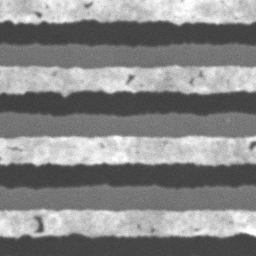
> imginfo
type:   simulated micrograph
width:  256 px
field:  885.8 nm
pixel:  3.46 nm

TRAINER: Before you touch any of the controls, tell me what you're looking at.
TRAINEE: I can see lines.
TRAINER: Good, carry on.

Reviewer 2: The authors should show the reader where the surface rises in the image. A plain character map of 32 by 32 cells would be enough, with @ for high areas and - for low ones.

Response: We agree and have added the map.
@@@@@@@@@@@@@@@@@@@@@@@@@@@@@@@@
@@@@@@@@@@@@@@@@@@@@@@@@@@@@@@@@
@@@@@@@@@@--@@@@@@@@@@@@@@@@@@@@
--------------------------------
--------------------------------
@---@------------------@--------
@@@@@@@@@@@@@@@@@@@@@@@@@@@@@@@@
@@@@@@@@@@@@@@@@@@@@@@@@@@@@@@@@
@@@@@@@@@@@@@@@@@@@@@@@@@@@@@@@@
@@@@@@@@@@@@@@@@@@@@@@@@@@@@@@@@
@@@@@@@@@@@@@@@@@@@@@@@@@@@@@@@@
@@@----@@----@--@------@@@@@@---
--------------------------------
--------------------------------
@@@@@@---@@@@@---@@@@@@@@-@@@@@@
@@@@@@@@@@@@@@@@@@@@@@@@@@@@@@@@
@@@@@@@@@@@@@@@@@@@@@@@@@@@@@@@@
@@@@@@@@@@@@@@@@@@@@@@@@@@@@@@@@
@@@@@@@@@@@@@@@@@@@@@@@@@@@@@@@@
@@@@@@@@@@@@@@@@@@@@@@@@@@@@@@@@
@---@@-@@@@@--@---@@-@--@@@@@@--
--------------------------------
--------------------------------
@---------@@@@@@@@@@-----@@@@-@@
@@@@@@@@@@@@@@@@@@@@@@@@@@@@@@@@
@@@@@@@@@@@@@@@@@@@@@@@@@@@@@@@@
@@@@@@@@@@@@@@@@@@@@@@@@@@@@@@@@
@@@@@@@@@@@@@@@@@@@@@@@@@@@@@@@@
@@@@@@@@@@@@@@@@@@@@@@@@@@@@@@@@
@@@-@@-@---@@-@@@@@@@@@@---@@---
--------------------------------
--------------------------------